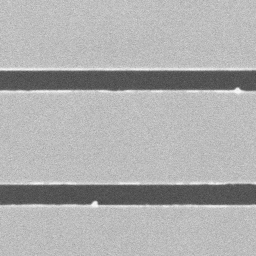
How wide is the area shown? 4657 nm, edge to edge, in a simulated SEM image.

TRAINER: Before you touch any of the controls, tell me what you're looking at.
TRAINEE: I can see lines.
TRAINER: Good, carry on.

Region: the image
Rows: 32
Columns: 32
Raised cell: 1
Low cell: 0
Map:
11111111111111111111111111111111
11111111111111111111111111111111
11111111111111111111111111111111
11111111111111111111111111111111
11111111111111111111111111111111
11111111111111111111111111111111
11111111111111111111111111111111
11111111111111111111111111111111
11111111111111111111111111111111
00000000000000000000000000000000
00000000000000000000000000000000
11111111111111111111111111111111
11111111111111111111111111111111
11111111111111111111111111111111
11111111111111111111111111111111
11111111111111111111111111111111
11111111111111111111111111111111
11111111111111111111111111111111
11111111111111111111111111111111
11111111111111111111111111111111
11111111111111111111111111111111
11111111111111111111111111111111
11111111111111111111111111111111
00000000000000000000000000000000
00000000000000000000000000000000
00000000000100000000000000000000
11111111111111111111111111111111
11111111111111111111111111111111
11111111111111111111111111111111
11111111111111111111111111111111
11111111111111111111111111111111
11111111111111111111111111111111